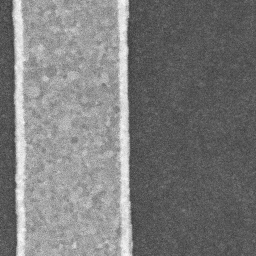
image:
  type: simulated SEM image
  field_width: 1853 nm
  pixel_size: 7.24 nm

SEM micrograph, one or a few lines or trenches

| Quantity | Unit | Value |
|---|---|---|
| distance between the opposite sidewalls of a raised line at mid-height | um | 0.745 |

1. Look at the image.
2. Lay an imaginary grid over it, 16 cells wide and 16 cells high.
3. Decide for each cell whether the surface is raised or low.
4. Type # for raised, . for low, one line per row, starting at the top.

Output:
.#######........
.#######........
.#######........
.#######........
.#######........
.#######........
.#######........
.#######........
.#######........
.#######........
.#######........
.#######........
.#######........
.#######........
.#######........
.#######........